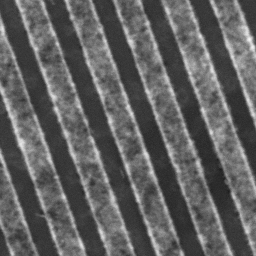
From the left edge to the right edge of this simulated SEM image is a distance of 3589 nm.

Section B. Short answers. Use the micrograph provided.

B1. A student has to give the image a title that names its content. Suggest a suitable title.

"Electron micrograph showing parallel lines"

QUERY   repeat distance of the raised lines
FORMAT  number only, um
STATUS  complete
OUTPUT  0.641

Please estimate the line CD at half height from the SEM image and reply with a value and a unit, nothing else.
331 nm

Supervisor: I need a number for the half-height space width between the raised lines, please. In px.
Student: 21.9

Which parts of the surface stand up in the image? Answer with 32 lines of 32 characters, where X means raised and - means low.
--XXX---XXX---XXXX--XXXX---XXX--
---XXX---XXX---XXX---XXX---XXX--
---XXX---XXX---XXX---XXX---XXX--
---XXX---XXXX---XXX---XXX---XXX-
X---XXX---XXX---XXX---XXX---XXX-
X---XXX---XXX---XXX---XXXX--XXXX
X---XXXX---XXX---XXX---XXX---XXX
XX---XXX---XXX---XXX---XXX---XXX
XX---XXX---XXX---XXXX--XXXX---XX
XXX---XXX---XXX---XXX---XXX---XX
XXX---XXX---XXX---XXX---XXX---XX
XXX---XXX---XXX---XXXX--XXXX---X
-XXX---XXX---XXX---XXX---XXX---X
-XXX---XXX---XXX---XXX---XXX---X
-XXX---XXXX--XXXX--XXXX---XXX---
--XXX---XXX---XXX---XXX---XXX---
--XXX---XXX---XXX---XXX---XXX---
--XXX---XXXX---XXX---XXX---XXX--
---XXX---XXX---XXX---XXX---XXX--
---XXX---XXX---XXX---XXX---XXXX-
---XXXX--XXXX---XXX---XXX---XXX-
X---XXX---XXX---XXX---XXX---XXX-
X---XXX---XXX---XXX---XXXX--XXXX
XX--XXXX---XXX---XXX---XXX---XXX
XX---XXX---XXX---XXX---XXX---XXX
XX---XXX---XXX---XXXX--XXXX---XX
XXX---XXX---XXX---XXX---XXX---XX
XXX---XXX---XXX---XXX---XXX---XX
XXX---XXX---XXXX---XXX---XXX---X
-XXX---XXX---XXX---XXX---XXX---X
-XXX---XXX---XXX---XXX---XXX---X
-XXX---XXX---XXXX---XXX---XXX---